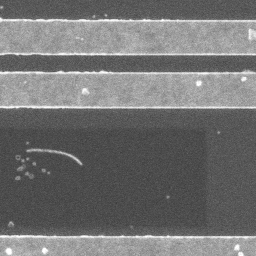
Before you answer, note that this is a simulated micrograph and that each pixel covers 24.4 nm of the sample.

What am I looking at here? lines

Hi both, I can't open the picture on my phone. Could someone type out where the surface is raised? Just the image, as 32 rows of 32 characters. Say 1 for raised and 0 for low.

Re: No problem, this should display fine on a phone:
00000000000000000000000000000000
00000000000000000000000000000000
11111111111111110110101000000000
11111111111111111111111111111111
11111111111111111111111111111111
11111111111111111111111111111111
11111111111111111111111111111111
00000000000000000000000000000000
00000000000000000000000000000000
11111111111111111111111111111111
11111111111111111111111111111111
11111111111111111111111111111111
11111111111111111111111111111111
00000000000000000000000000000000
00000000000000000000000000000000
00000000000000000000000000000000
00000000000000000000000000000000
00000000000000000000000000000000
00000000000000000000000000000000
00000000000000000000000000000000
00000000000000000000000000000000
00000000000000000000000000000000
00000000000000000000000000000000
00000000000000000000000000000000
00000000000000000000000000000000
00000000000000000000000000000000
00000000000000000000000000000000
00000000000000000000000000000000
00000000000000000000000000000000
00000000000000000000000000000000
11111111111111111111111111111111
11111111111111111111111111111111